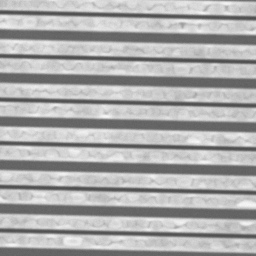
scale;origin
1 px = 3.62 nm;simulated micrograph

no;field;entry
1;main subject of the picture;parallel lines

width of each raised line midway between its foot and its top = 52.5 nm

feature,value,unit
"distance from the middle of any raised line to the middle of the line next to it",21.8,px